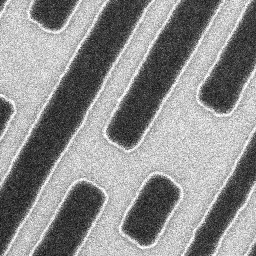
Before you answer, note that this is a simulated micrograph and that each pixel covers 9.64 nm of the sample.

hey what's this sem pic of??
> parallel lines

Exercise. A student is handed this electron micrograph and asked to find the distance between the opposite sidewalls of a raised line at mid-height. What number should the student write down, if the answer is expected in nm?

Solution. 386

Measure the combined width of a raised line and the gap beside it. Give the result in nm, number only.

605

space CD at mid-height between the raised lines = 213 nanometres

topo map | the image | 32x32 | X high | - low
X---XXXXXX---XXXXXX---XXXXXX---X
----XXXXX---XXXXXX---XXXXXX---XX
----XXXXX---XXXXXX---XXXXXX---XX
-----XXX---XXXXXX---XXXXXX---XXX
-----------XXXXXX---XXXXX----XXX
----------XXXXXX---XXXXXX---XXXX
---------XXXXXX---XXXXXX----XXXX
---------XXXXXX---XXXXXX---XXXXX
--------XXXXXX---XXXXXX---XXXXXX
--------XXXXXX---XXXXX----XXXXXX
-------XXXXXX---XXXXXX---XXXXXX-
-------XXXXXX---XXXXX----XXXXX--
X-----XXXXXX---XXXXXX----XXXXX--
XX---XXXXXX---XXXXXX------XXX---
XX---XXXXXX---XXXXXX------------
X---XXXXXX---XXXXXX-------------
X---XXXXXX---XXXXX--------------
---XXXXXX-----XXXX-------------X
---XXXXX-------XX--------------X
--XXXXXX----------------------XX
-XXXXXX----------------------XXX
-XXXXXX----------------------XXX
XXXXXX----X-------XXXX------XXXX
XXXXX----XXXX-----XXXXX-----XXXX
XXXXX---XXXXX----XXXXXX----XXXX-
XXXX----XXXXX---XXXXXX----XXXXX-
XXXX---XXXXXX---XXXXXX----XXXX--
XXX---XXXXXX---XXXXXX----XXXX---
XX----XXXXXX---XXXXXX----XXXX---
XX---XXXXXX-----XXXX----XXXX----
X----XXXXX-------XX-----XXX----X
X---XXXXXX-------------XXXX----X